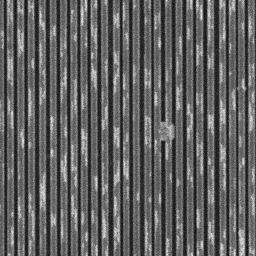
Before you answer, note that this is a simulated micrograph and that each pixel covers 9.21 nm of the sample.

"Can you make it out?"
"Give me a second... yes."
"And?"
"parallel lines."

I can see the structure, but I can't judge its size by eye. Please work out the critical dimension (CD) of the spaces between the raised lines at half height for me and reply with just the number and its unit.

44.9 nm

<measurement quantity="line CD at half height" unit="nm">55.3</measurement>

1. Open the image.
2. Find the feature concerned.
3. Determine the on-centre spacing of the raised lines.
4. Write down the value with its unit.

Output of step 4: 96.6 nm